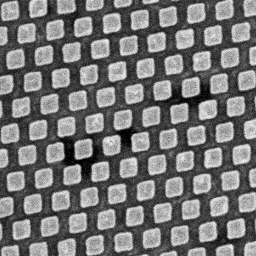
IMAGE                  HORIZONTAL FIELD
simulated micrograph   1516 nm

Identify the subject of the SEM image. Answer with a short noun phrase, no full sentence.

a regular array of raised bodies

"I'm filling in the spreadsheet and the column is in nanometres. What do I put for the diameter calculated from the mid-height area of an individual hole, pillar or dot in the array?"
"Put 116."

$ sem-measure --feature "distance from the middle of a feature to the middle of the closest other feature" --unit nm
166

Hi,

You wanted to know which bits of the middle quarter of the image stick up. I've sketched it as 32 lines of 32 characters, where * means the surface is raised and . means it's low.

......**...****...****...*****..
*...****...****...****...*****..
*...****...*****..****..........
*...****...****.................
*...****...............****...**
*................***...****...**
.........****..*****..*****...**
..****..*****..*****...****...**
.****...*****..*****...***......
.*****..*****...**..............
..****...*.................****.
..*.................****...****.
........*....****...****...****.
**....****...****...****...****.
***...****...****...****...**...
***...****...****...*...........
***...***.................**...*
**.................**...****...*
..........****...****...****...*
...****...****...****...****...*
...****...****...****...****....
...****...****...***............
...****...**.................***
...**............*...****...****
..............****...****...****
..**...****...****...****...****
****...****...****...****...***.
****...****...****...*..........
****...****.................*...
****................**...*****..
.............**...****...*****..
.....***...****...*****..*****..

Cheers